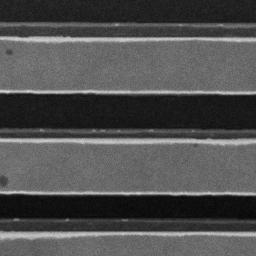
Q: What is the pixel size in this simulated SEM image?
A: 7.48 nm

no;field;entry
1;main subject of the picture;lines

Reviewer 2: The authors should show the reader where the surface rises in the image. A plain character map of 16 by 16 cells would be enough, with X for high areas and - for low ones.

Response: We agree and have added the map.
----------------
----------------
XXXXXXXXXXXXXXXX
XXXXXXXXXXXXXXXX
XXXXXXXXXXXXXXXX
XXXXXXXXXXXXXXXX
----------------
----------------
----------------
XXXXXXXXXXXXXXXX
XXXXXXXXXXXXXXXX
XXXXXXXXXXXXXXXX
----------------
----------------
XXX-XXXXXXXX----
XXXXXXXXXXXXXXXX